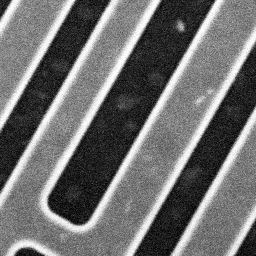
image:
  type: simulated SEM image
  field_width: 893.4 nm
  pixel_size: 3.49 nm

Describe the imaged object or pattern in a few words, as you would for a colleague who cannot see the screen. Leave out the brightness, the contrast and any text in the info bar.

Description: one or a few lines or trenches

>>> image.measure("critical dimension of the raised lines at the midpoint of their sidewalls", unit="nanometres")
177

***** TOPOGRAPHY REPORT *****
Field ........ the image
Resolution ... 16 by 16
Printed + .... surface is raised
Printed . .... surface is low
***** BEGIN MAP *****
.+++...+++...+++
++++..+++....+++
+++...++....++++
+++..+++....+++.
++...++....++++.
+...+++...++++..
+..+++....++++..
...+++...++++...
..+++....+++...+
..++....++++...+
.+++....+++...++
.++....++++..+++
+++...++++...+++
+++...++++..++++
+++++++++...+++.
+.++++++...++++.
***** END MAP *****